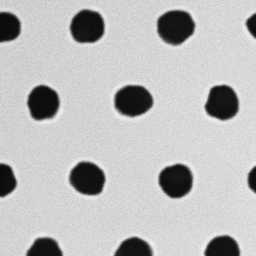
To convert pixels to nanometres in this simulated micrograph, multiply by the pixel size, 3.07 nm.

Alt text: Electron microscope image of holes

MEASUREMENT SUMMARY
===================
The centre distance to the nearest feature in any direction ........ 0.269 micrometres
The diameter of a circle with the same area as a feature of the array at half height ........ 0.107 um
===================